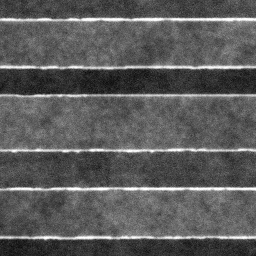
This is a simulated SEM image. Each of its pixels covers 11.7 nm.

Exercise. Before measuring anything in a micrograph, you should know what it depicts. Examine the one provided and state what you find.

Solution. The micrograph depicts lines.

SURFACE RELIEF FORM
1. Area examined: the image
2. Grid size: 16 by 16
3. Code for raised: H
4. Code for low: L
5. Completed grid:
LLLLLLLLLLLLLLLL
HHHHHHHHHHHHHHHH
HHHHHHHHHHHHHHHH
HHHHHHHHHHHHHHHH
LLLLLLLLLLLLLLLL
LLLLLLLLLLLLLLLL
HHHHHHHHHHHHHHHH
HHHHHHHHHHHHHHHH
HHHHHHHHHHHHHHHH
LLLLLLLLLLLLLLLL
LLLLLLLLLLLLLLLL
LLLLLLLLLLLLLLLL
HHHHHHHHHHHHHHHH
HHHHHHHHHHHHHHHH
HHHHHHHHHHHHHHHH
LLLLLLLLLLLLLLLL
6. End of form